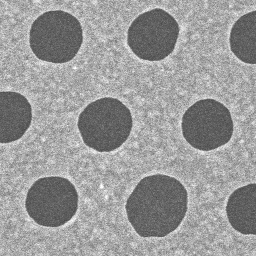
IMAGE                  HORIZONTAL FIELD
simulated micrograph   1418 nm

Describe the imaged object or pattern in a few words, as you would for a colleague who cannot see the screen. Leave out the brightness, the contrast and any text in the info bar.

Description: holes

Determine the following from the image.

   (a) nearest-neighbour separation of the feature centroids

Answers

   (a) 527 nm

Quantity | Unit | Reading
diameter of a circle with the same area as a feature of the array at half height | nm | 295